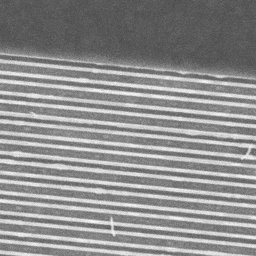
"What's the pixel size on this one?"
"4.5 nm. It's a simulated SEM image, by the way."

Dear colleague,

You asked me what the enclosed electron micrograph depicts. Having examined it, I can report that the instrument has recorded parallel lines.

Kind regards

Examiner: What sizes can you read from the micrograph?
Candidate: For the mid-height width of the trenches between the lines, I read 25.2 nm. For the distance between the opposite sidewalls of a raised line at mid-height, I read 0.0131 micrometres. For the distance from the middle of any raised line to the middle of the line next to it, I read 0.0449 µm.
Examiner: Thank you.